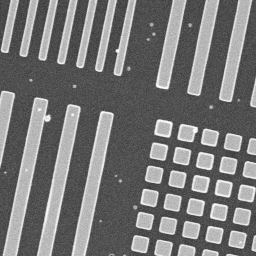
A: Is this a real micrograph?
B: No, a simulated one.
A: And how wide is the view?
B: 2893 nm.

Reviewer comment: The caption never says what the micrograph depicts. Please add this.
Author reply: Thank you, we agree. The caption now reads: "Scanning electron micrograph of groups of lines, slits or small figures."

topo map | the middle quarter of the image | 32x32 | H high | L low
LLLHHLLLHHLLLHHLLLLLLLLLHHHLLLLL
LLLLLLLLHHLLLHHLLLLLLLLLHHHLLLLL
LLLLLLLLLLLLLHLLLLLLLLLLHHHLLLLL
LLLLLLLLLLLLLLLLLLLLLLLHHHHLLLLL
LLLLLLLLLLLLLLLLLLLLLLLHHHLLLLLH
LLLLLLLLLLLLLLLLLLLLLLLHHHLLLLLH
LLLLLLLLLLLLLLLLLLLLLLLLLLLLLLLH
LLLLLLLLLLLLLLLLLLLLLLLLLLLLLLLH
LLLLLLLLLLLLLLLLLLLLLLLLLLLLLLLL
LLLLLLLLLLLLLLLLLLLLLLLLLLLLLLLL
LHHLLLLLLLLLLLLLLLLLLLLLLLLLLLLL
LHHHLLLLLLLLLLLLLLLLLLLLLLLLLLLL
LHHHLLLLLHHHLLLLLLLLLLLLLLLLLLLL
HHHHLLLLLHHHLLLLLLLLLLLLLLLLLLLL
HHHLLLLLLHHHLLLLLLLLLLLHHHHLLLLL
HHHLLLLLLHHHLLLLLLLLLLLHHHHLLHHH
HHHLLLLLHHHHLLLLLLLLLLLHHHHLLHHH
HHHLLLLLHHHLLLLLLLLLLLLHHHHLLHHH
HHHLLLLLHHHLLLLLLLLLLLLLLLLLLHHH
HHHLLLLLHHHLLLLLLLLLLLLLLLLLLLLL
HHLLLLLLHHHLLLLLLLLLLLHHHHLLLLLL
HHLLLLLHHHLLLLLLLLLLLLHHHHLLHHHL
HHLLLLLHHHLLLLLLLLLLLLHHHHLLHHHH
HHLLLLLHHHLLLLLLLLLLLLHHHLLHHHHL
HLLLLLLHHHLLLLLLLLLLLLLLLLLLHHHL
HLLLLLHHHHLLLLLLLLLLLLLLLLLLLLLL
HLLLLLHHHHLLLLLLLLLLLHHHHLLLLLLL
HLLLLLHHHLLLLLLLLLLLLHHHHLLHHHLL
HLLLLLHHHLLLLLLLLLLLLHHHLLLHHHLL
LLLLLLHHHLLLLLLLLLLLLHHHLLHHHHLL
LLLLLHHHHLLLLLLLLLLLLLLLLLLHHHLL
LLLLLHHHHLLLLLLLLLLLHHLLLLLLLLLL